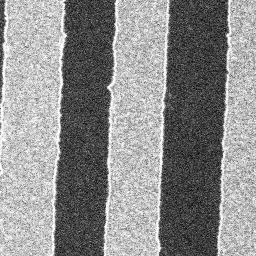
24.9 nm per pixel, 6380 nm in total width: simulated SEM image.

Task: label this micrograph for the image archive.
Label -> one or a few lines or trenches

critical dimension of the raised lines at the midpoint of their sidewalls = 1310 nm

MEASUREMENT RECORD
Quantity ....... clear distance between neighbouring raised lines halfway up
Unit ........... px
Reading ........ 57.1